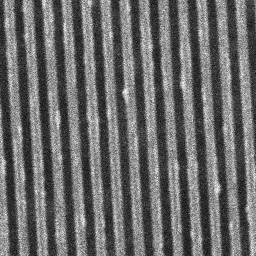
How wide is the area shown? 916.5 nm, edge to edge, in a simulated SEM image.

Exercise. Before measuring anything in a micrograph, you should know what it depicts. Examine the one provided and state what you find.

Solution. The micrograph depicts parallel lines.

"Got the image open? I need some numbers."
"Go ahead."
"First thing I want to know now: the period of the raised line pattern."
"0.069 um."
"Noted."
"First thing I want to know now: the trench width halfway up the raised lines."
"37.1 nm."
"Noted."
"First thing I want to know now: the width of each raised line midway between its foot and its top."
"34 nm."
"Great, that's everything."